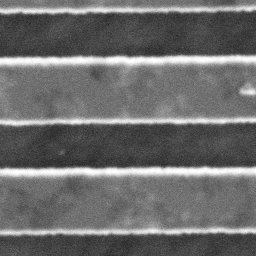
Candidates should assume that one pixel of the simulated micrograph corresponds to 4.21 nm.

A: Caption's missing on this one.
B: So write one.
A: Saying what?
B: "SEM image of lines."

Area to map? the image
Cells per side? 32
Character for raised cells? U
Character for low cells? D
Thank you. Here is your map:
UUUUUUUUUUUUUUUUUUUUUUUUUUUUUUUU
UUDUUDUDDUDDDDDDDDDDDDDDDDDDDDDD
DDDDDDDDDDDDDDDDDDDDDDDDDDDDDDDD
DDDDDDDDDDDDDDDDDDDDDDDDDDDDDDDD
DDDDDDDDDDDDDDDDDDDDDDDDDDDDDDDD
DDDDDDDDDDDDDDDDDDDDDDDDDDDDDDDD
DDDDDDDDDDDDDDDDDDDDDDDDDDDDDDDD
UUUUUUUUUUUUUUUUUUUUUUUUUUUUUUUU
UUUUUUUUUUUUUUUUUUUUUUUUUUUUUUUU
UUUUUUUUUUUUUUUUUUUUUUUUUUUUUUUU
UUUUUUUUUUUUUUUUUUUUUUUUUUUUUUUU
UUUUUUUUUUUUUUUUUUUUUUUUUUUUUUUU
UUUUUUUUUUUUUUUUUUUUUUUUUUUUUUUU
UUUUUUUUUUUUUUUUUUUUUUUUUUUUUUUU
UUUUUUUUUUUUUUUUUUUUUUUUUUUUUUUU
DUUDDDDDDDDDDDDDDDDDDDDDDDDDDDDD
DDDDDDDDDDDDDDDDDDDDDDDDDDDDDDDD
DDDDDDDDDDDDDDDDDDDDDDDDDDDDDDDD
DDDDDDDDDDDDDDDDDDDDDDDDDDDDDDDD
DDDDDDDDDDDDDDDDDDDDDDDDDDDDDDDD
DDDDDDDDDDDDDDDDDDDDDDDDDDDDDDDD
UUUUUUUUUUUUUUUUUUUUUUUUUUUUUUUU
UUUUUUUUUUUUUUUUUUUUUUUUUUUUUUUU
UUUUUUUUUUUUUUUUUUUUUUUUUUUUUUUU
UUUUUUUUUUUUUUUUUUUUUUUUUUUUUUUU
UUUUUUUUUUUUUUUUUUUUUUUUUUUUUUUU
UUUUUUUUUUUUUUUUUUUUUUUUUUUUUUUU
UUUUUUUUUUUUUUUUUUUUUUUUUUUUUUUU
UUUUUUUUUUUUUUUUUUUUUUUUUUUUUUUU
DDDDDDDDDDDDDDDDDDDDDDDDDDDDDDDD
DDDDDDDDDDDDDDDDDDDDDDDDDDDDDDDD
DDDDDDDDDDDDDDDDDDDDDDDDDDDDDDDD